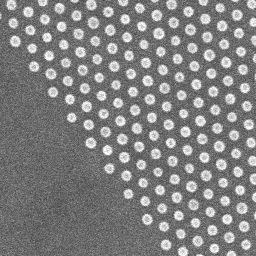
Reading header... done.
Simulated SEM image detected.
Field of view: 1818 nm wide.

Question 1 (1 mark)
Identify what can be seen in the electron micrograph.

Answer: a regular array of raised bodies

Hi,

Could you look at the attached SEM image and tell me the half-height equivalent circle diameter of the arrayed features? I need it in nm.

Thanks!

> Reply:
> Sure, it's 61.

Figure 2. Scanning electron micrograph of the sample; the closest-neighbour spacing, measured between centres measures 129 nm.